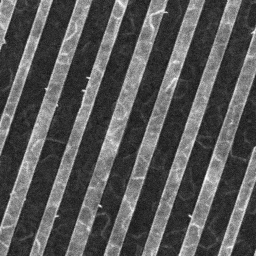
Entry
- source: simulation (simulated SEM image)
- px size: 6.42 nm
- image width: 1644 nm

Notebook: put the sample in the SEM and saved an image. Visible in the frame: parallel lines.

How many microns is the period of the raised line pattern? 0.229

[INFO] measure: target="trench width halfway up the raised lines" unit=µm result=0.145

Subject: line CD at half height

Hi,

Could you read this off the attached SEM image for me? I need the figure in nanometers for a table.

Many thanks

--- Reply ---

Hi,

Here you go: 85.9